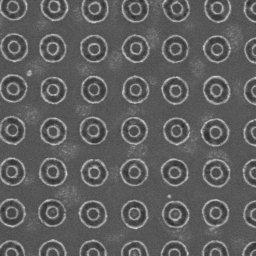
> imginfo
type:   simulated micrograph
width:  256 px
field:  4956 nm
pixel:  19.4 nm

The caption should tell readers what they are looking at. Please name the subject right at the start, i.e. a regular array of ring-shaped raised bodies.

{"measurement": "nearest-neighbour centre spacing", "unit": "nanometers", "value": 774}